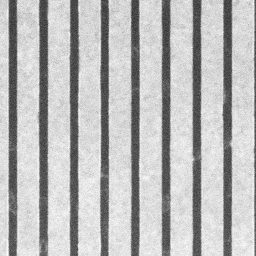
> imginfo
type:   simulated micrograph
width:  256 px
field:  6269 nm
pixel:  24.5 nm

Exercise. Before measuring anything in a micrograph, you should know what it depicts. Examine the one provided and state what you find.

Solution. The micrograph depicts parallel lines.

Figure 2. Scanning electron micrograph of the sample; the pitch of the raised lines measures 750 nanometers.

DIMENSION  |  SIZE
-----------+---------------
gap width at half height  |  9.25 pixels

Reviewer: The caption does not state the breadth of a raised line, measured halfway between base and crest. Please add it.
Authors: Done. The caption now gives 514 nm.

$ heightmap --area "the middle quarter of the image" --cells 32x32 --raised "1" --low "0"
10001111100111111001111100011111
10001111100111111001111100011111
10001111100111111001111100011111
10001111100111111001111100011111
10001111100111111001111100011111
10001111100111111001111100011111
10001111100111111001111100011111
10001111100111111001111100011111
10001111100111111001111100011111
10001111100111111001111100011111
10001111100111111001111100011111
10001111100111111001111100011111
10001111100111111001111100011111
10001111100111111001111100011111
10001111100111111001111100011111
10001111100111111001111100011111
10001111100111111001111100011111
10001111100111111001111100011111
10001111100111111001111100011111
10001111100111111001111100011111
10001111100111111001111100011111
10001111100111111001111100011111
10001111100111111001111100011111
10001111100111111001111100011111
10001111100111111001111100011111
10001111100111111001111100011111
10001111100111111001111100011111
10001111100111111001111100011111
10001111100111111001111100011111
10001111100111111001111100011111
10001111100111111001111100011111
10001111100111111001111100011111